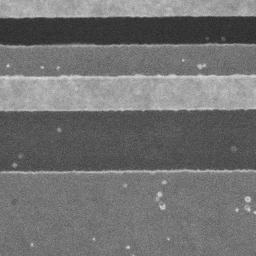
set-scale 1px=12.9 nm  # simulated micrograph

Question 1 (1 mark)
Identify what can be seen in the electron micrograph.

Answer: lines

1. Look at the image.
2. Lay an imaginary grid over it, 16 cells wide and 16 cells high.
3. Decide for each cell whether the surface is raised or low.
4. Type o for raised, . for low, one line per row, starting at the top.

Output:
oooooooooooooooo
................
................
oooooooooooooooo
oooooooooooooooo
oooooooooooooooo
oooooooooooooooo
................
................
................
................
oooooooooooooooo
oooooooooooooooo
oooooooooooooooo
oooooooooooooooo
oooooooooooooooo